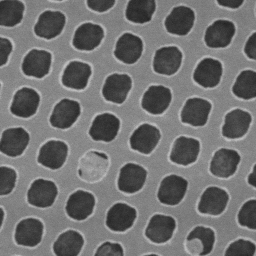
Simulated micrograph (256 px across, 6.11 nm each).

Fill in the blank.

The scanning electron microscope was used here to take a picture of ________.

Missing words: a regular array of holes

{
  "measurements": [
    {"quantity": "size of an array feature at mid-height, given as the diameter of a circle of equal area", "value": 189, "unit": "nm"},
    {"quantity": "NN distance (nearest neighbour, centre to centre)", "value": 0.247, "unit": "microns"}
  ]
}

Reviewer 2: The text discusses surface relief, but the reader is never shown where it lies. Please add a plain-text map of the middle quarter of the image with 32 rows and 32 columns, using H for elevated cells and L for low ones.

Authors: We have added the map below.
LLLLLLLHHHHHHHHHHHHHHHLLLLLLLHHH
LLLLLLLHHHHHHHHHHHHHHHLLLLLLLHHH
LLLLLLLHHHHHLLLLHHHHHHHHLLLLHHHH
LLLLLLLHHHLLLLLLLHHHHHHHHHHHHHHH
LLLLLLHHHHLLLLLLLHHHHHHHHHHHHHHH
LLLLLLHHHHLLLLLLLHHHHLLLLHHHHHHH
HHLLLHHHHLLLLLLLLHHHLLLLLLLHHHHH
HHHHHHHHHLLLLLLLHHHHLLLLLLLHHHHH
HHHHHHHHHHLLLLLLHHHLLLLLLLLHHHHL
LLLLHHHHHHHLLLLHHHHLLLLLLLLHHHLL
LLLLHHHHHHHHHHHHHHHLLLLLLLHHHHLL
LLLLHHHHHHHHHHHHHHHHLLLLLLHHHLLL
LLLLHHHHHLLLHHHHHHHHHLLLLHHHHLLL
LLLHHHHLLLLLLLHHHHHHHHHHHHHHHLLL
LLLHHHHLLLLLLLHHHHHHHHHHHHHHHLLL
LLHHHHHLLLLLLLHHHHHLLLLHHHHHHHHH
HHHHHHLLLLLLLLHHHHLLLLLLHHHHHHHH
HHHHHHLLLLLLLLHHHLLLLLLLHHHHHHHH
HHHHHHHLLLLLLHHHLLLLLLLLHHHHLLLL
HHHHHHHHHHLHHHHHLLLLLLLLHHHLLLLL
LHHHHHHHHHHHHHHHLLLLLLLHHHHLLLLL
LHHHHHHHHHHHHHHHHLLLLLHHHHHLLLLL
LHHHHLLLLLLHHHHHHHHLLHHHHHLLLLLL
LHHHHHHLLLLHHHHHHHHHHHHHHHLLLLLL
HHHHHHHHHLLHHHHHHHHHHHHHHHHLLLLL
HHHHHHHHHHLHHHHLLLLHHHHHHHHHHLLH
HHHHLHLLLHLHHHLLLLLLLHHHHHHHHHHH
HHHHLLLLLLHHHHLLLLLLLHHHHHHLHHHH
HHHHLLLLLHHHHLLLLLLLLHHHHLLLLLHH
HHHHHHLHHHHHHLLLLLLLHHHHLLLLLLLH
HHHHHHHHHHHHHLLLLLLLHHHHLLLLLLLH
HHHLLHHHHHHHHHLLLLLHHHHHLLLLLLLH